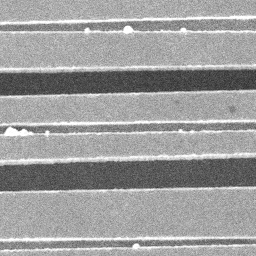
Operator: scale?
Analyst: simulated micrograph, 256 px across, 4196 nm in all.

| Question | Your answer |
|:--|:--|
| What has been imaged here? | lines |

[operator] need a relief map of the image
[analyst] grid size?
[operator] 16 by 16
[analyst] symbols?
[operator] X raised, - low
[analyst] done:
XXXXXXXXXXXXXXXX
XXXXXXXXXXXXXXXX
XXXXXXXXXXXXXXXX
XXXXXXXXXXXXXXXX
----------------
----------------
XXXXXXXXXXXXXXXX
XXXXXXXXXXXXXXXX
XXXXXXXXXXXXXXXX
XXXXXXXXXXXXXXXX
----------------
----------------
XXXXXXXXXXXXXXXX
XXXXXXXXXXXXXXXX
XXXXXXXXXXXXXXXX
XXXXXXXXXXXXXXXX